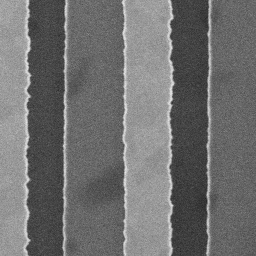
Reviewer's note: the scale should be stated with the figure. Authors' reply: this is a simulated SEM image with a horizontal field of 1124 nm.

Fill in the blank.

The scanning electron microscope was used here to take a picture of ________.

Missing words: lines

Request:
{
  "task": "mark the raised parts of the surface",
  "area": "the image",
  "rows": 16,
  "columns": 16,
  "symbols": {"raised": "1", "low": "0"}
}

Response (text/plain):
1100111111100111
1100111111100111
1100111111100111
1100111111100111
1100111111100111
1100111111100111
1100111111100111
1100111111100111
1100111111100111
1100111111100111
1100111111100111
1100111111100111
1100111111100111
1100111111100111
1100111111100111
1100111111100111